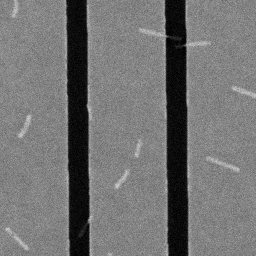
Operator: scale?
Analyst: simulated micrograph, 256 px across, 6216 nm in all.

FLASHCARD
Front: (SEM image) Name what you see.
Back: lines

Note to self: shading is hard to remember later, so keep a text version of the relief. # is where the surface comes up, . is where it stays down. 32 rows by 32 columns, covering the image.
########...##########..#########
########...##########..#########
########...##########..#########
########...##########..#########
########...##########..#########
########...##########..#########
########...##########..#########
########...##########..#########
########...##########..#########
########...##########..#########
########...##########..#########
########...##########..#########
########...##########..#########
########...##########..#########
########...##########...########
########...##########...########
########...##########...########
########...##########...########
########...##########...########
########...##########...########
########...##########...########
#########..##########...########
#########..##########...########
#########..##########...########
#########..##########...########
#########..##########...########
#########..##########...########
#########..##########...########
#########..##########...########
#########..##########...########
#########..##########...########
#########..##########...########